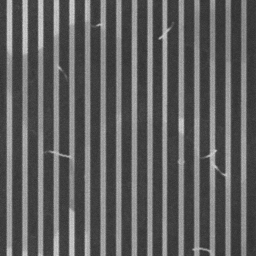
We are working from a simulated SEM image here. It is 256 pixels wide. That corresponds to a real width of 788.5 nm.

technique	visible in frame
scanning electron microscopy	parallel lines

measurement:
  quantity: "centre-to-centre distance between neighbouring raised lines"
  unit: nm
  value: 48.1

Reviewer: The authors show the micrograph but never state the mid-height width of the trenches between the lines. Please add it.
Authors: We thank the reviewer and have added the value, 34.7 nm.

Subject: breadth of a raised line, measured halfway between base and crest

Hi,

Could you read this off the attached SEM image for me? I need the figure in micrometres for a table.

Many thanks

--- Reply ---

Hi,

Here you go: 0.0135